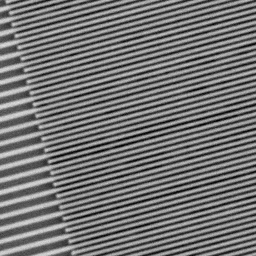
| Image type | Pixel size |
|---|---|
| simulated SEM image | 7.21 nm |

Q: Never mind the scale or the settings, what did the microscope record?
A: parallel lines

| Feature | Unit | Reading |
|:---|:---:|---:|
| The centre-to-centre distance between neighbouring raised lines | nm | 42.6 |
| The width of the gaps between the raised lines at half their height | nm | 13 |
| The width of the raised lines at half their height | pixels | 3.63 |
